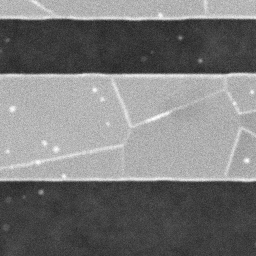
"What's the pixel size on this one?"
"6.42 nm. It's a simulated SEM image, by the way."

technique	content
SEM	wiring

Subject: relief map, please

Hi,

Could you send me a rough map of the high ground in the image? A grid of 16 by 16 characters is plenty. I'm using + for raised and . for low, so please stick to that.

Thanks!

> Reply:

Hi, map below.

++++++++++++++++
................
................
................
................
++++++++++++++++
++++++++++++++++
++++++++++++++++
++++++++++++++++
++++++++++++++++
++++++++++++++++
................
................
................
................
................